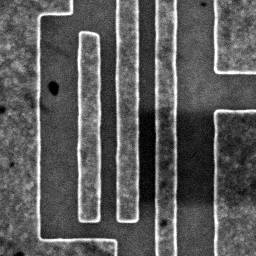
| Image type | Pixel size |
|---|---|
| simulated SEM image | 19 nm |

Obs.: wiring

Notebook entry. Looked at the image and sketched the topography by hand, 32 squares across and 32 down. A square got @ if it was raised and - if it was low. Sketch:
@@@@@@@@@------@@---@@-----@@@@@
@@@@@@@@@------@@---@@-----@@@@@
@@@@@----------@@---@@-----@@@@@
@@@@@----------@@---@@-----@@@@@
@@@@@-----@@---@@---@@-----@@@@@
@@@@@-----@@---@@---@@-----@@@@@
@@@@@-----@@---@@---@@-----@@@@@
@@@@@-----@@---@@---@@-----@@@@@
@@@@@-----@@---@@---@@-----@@@@@
@@@@@-----@@---@@---@@----------
@@@@@-----@@---@@---@@----------
@@@@@-----@@---@@---@@----------
@@@@@-----@@---@@---@@----------
@@@@@-----@@---@@---@@----------
@@@@@-----@@---@@---@@-----@@@@@
@@@@@-----@@---@@---@@-----@@@@@
@@@@@-----@@---@@---@@-----@@@@@
@@@@@-----@@---@@---@@-----@@@@@
@@@@@-----@@---@@---@@-----@@@@@
@@@@@-----@@---@@---@@-----@@@@@
@@@@@-----@@---@@---@@-----@@@@@
@@@@@-----@@---@@---@@-----@@@@@
@@@@@-----@@---@@---@@-----@@@@@
@@@@@-----@@---@@---@@-----@@@@@
@@@@@-----@@---@@---@@-----@@@@@
@@@@@-----@@---@@---@@-----@@@@@
@@@@@-----@@---@@---@@-----@@@@@
@@@@@-----@@---@@---@@-----@@@@@
@@@@@---------------@@-----@@@@@
@@@@@---------------@@-----@@@@@
@@@@@@@@@@@@@@@-----@@-----@@@@@
@@@@@@@@@@@@@@@-----@@-----@@@@@